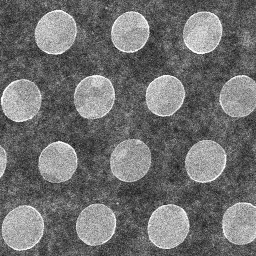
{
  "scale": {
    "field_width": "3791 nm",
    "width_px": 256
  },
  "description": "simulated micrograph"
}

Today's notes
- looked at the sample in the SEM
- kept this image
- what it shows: a regular array of raised bodies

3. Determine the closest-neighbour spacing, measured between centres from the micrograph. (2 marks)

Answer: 1070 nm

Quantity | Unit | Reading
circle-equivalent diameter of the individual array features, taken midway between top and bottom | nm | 610